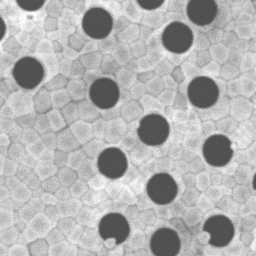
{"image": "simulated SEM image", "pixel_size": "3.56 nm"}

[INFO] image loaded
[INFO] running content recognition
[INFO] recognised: a regular array of holes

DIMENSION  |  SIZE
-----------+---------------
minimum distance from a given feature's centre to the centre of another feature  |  214 nm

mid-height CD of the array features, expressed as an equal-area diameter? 110 nanometres